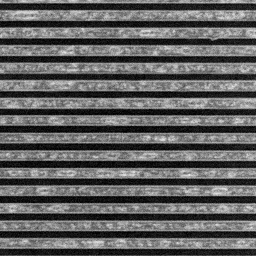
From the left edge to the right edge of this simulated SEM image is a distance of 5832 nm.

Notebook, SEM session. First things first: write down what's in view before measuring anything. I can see parallel lines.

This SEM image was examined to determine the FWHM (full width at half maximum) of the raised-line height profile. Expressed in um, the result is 0.222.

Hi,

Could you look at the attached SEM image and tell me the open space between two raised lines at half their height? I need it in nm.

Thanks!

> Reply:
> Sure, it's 179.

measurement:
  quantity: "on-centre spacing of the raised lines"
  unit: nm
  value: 399